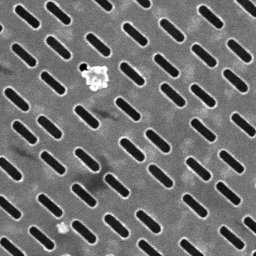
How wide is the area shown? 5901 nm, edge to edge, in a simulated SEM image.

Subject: a regular array of holes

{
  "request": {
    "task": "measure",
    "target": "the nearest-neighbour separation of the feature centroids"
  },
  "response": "785 nm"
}